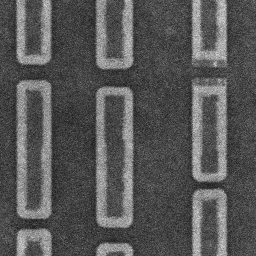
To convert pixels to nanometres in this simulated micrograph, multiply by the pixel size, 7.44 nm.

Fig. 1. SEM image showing one or a few lines or trenches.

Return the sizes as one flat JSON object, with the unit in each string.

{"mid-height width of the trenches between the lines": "400 nanometers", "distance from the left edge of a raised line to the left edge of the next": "0.65 µm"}